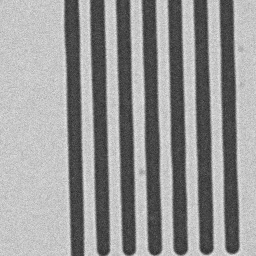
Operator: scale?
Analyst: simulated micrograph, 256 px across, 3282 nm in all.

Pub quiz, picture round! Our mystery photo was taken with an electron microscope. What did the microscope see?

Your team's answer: groups of lines, slits or small figures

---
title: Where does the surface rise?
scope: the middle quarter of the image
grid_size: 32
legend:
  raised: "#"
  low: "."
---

....###....##....###....##....##
....###....##....###....##....##
....###....##....###....##....##
....###....##....###....##....##
....###....##....###....##....##
....###....##....###....##....##
.....##....##....###....##....##
.....##....##....###....##....##
.....##....##....###....##....##
.....##....##....###....##....##
.....##....##....###....##....##
.....##....##....###....##....##
#....##....##....###....##....##
#....##....##....###....##....##
#....##....##.....##....##....##
#....##....###....##....##....##
#....##....###....##....##.....#
#....##....###....##....##.....#
#....##....###....##....##.....#
#....##....###....##....##.....#
#....##....###....##....##.....#
#....##....###....##....###....#
#....##....###....##....###....#
#....##....###....##....###....#
#....##....###....##....###....#
#....##....###....##....###....#
#....##....###....##....###....#
#....##....###....##....###....#
#....##....###....##....###....#
#....##....###....##....###....#
#....##....###....##....###....#
#....###...###....##....###....#